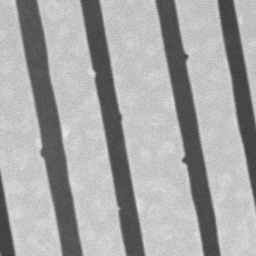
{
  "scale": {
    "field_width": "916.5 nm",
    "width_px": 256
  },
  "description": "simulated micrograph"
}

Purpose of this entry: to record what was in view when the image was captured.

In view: one or a few lines or trenches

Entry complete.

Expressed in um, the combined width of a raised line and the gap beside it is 0.24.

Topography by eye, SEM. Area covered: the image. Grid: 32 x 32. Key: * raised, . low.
**...*****...******...*****..***
**...*****...*******..*****..***
**...*****...*******..******..**
***..******..*******..******..**
***...*****..*******...*****..**
***...*****..*******...*****..**
***...*****...*******..*****..**
***...*****...*******..*****...*
***...******..*******..******..*
****..******..*******...*****..*
****..******..*******...*****..*
****...*****..********..*****..*
****...*****...*******..*****..*
****...******..*******..*****...
*****..******..*******...*****..
*****...*****..*******...*****..
*****...*****..********..*****..
*****...*****...*******..*****..
*****...*****...*******..*****..
*****...******..*******..******.
******..******..*******...*****.
******...*****..*******...*****.
******...*****..********..*****.
******...*****...*******..*****.
.*****...*****...*******..******
.******..******..*******...*****
.******..******..*******...*****
.******...*****..********..*****
.******...*****...*******..*****
..*****...*****...*******..*****
..******..*****...*******..*****
..******..******..*******...****